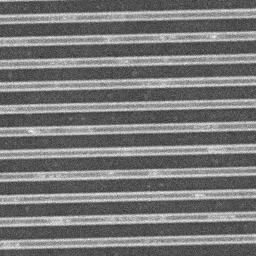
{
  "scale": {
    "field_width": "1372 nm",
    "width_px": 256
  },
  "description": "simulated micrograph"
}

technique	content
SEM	parallel lines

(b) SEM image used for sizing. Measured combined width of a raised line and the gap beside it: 121 nanometres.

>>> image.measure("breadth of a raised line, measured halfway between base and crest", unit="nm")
45.6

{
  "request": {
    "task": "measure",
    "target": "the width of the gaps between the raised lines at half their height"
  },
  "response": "14.3 px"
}